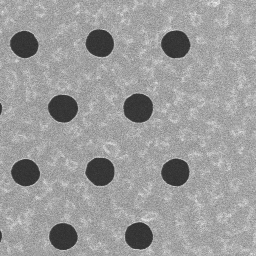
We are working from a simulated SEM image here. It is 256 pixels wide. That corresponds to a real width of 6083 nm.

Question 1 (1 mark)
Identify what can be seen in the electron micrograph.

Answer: a regular array of holes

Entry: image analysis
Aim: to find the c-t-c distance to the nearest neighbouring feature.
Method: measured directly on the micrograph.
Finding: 1.76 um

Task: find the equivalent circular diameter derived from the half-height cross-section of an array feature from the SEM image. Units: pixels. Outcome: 28.3